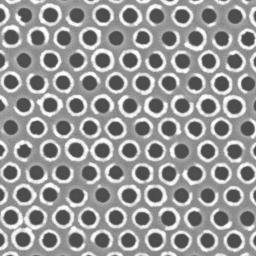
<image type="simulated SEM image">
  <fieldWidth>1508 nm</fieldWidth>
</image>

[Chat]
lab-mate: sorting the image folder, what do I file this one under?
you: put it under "a regular array of holes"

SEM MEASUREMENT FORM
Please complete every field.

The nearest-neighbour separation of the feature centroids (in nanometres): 151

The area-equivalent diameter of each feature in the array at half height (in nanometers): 87.2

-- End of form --